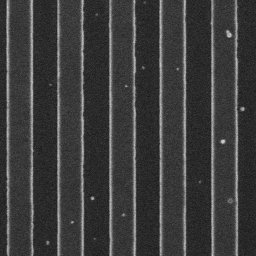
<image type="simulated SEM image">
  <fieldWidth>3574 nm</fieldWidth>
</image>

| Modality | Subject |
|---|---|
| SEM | lines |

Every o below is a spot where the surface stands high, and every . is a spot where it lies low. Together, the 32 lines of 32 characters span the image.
.ooo...ooo....ooo...ooo....ooo..
.ooo...ooo....ooo...ooo....ooo..
.ooo...ooo....ooo...ooo....ooo..
.ooo...ooo....ooo...ooo....ooo..
.ooo...ooo....ooo...ooo....ooo..
.ooo...ooo....ooo...ooo....ooo..
.ooo...ooo....ooo...ooo....ooo..
.ooo...ooo....ooo...ooo....ooo..
.ooo...ooo....ooo...ooo....ooo..
.ooo...ooo....ooo...ooo....ooo..
.ooo...ooo....ooo...ooo....ooo..
.ooo...ooo....ooo...ooo....ooo..
.ooo...ooo....ooo...ooo....ooo..
.ooo...ooo....ooo...ooo....ooo..
.ooo...ooo....ooo...ooo....ooo..
.ooo...ooo....ooo...ooo....ooo..
.ooo...ooo....ooo...ooo....ooo..
.ooo...ooo....ooo...ooo....ooo..
.ooo...ooo....ooo...ooo....ooo..
.ooo...ooo....ooo...ooo....ooo..
.ooo...ooo....ooo...ooo....ooo..
.ooo...ooo....ooo...ooo....ooo..
.ooo...ooo....ooo...ooo....ooo..
.ooo...ooo....ooo...ooo....ooo..
.ooo...ooo....ooo...ooo....ooo..
.ooo...ooo....ooo...ooo....ooo..
.ooo...ooo....ooo...ooo....ooo..
.ooo...ooo....ooo...ooo....ooo..
.ooo...ooo....ooo...ooo....ooo..
.ooo...ooo....ooo...ooo....ooo..
.ooo...ooo....ooo...ooo....ooo..
.ooo...ooo....ooo...ooo....ooo..